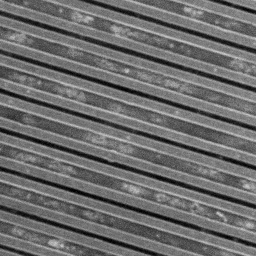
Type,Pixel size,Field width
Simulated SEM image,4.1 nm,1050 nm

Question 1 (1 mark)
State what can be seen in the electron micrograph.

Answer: parallel lines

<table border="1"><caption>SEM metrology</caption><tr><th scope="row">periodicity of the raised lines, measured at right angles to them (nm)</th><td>76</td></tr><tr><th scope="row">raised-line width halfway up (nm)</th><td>40.2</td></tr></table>